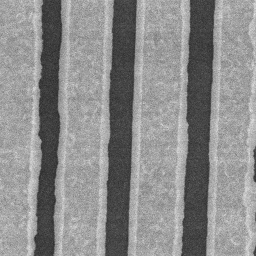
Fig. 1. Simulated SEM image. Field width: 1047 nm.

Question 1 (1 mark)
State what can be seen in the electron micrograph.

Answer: one or a few lines or trenches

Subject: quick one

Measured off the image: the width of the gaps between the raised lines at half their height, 126 nm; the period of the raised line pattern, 0.308 microns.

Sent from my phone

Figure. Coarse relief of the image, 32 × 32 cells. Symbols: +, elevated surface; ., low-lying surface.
+++++...++++++....+++++....+++++
+++++...++++++....+++++....+++++
+++++...++++++....+++++....+++++
+++++...++++++...++++++....+++++
+++++...++++++...++++++....+++++
+++++...+++++....++++++....+++++
+++++...+++++....++++++....+++++
+++++...+++++....++++++....+++++
+++++...+++++....++++++....+++++
+++++...+++++....++++++....+++++
+++++...+++++....++++++....+++++
+++++...+++++....++++++....+++++
+++++...+++++....++++++....+++++
+++++...+++++....++++++....+++++
++++....+++++....++++++....+++++
+++++...+++++....++++++....+++++
+++++...+++++....++++++....+++++
+++++...+++++....++++++....+++++
++++....+++++....++++++....++++.
+++++...+++++....++++++....++++.
+++++...+++++....++++++....++++.
++++....+++++....++++++....++++.
++++...++++++....++++++....++++.
++++...++++++....++++++....++++.
++++....+++++....++++++....+++++
++++....+++++....++++++....++++.
++++...++++++....++++++....++++.
++++...++++++....+++++.....++++.
++++...++++++....+++++....++++++
++++...++++++....+++++....++++++
++++...++++++....+++++....++++++
++++...++++++....+++++....+++++.